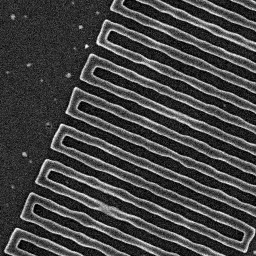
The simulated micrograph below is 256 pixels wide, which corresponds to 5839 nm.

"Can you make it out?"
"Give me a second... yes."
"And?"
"groups of lines, slits or small figures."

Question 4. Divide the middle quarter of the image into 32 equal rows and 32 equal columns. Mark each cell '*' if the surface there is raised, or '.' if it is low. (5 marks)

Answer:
.....********........*****......
.....**....*****.......*****....
....***......*****.......*****..
....*****.......****.......*****
......*****.......*****.......**
.........****.......*****.......
...*.......*****.......****.....
..****.......*****......******..
..*******......*****.......*****
..**.******.......****.......***
.**.....******......*****.......
.***......******......*****.....
.*****.......*****.......****...
...******.....******.......****.
......*****.......****........**
*......******.......*****......*
***.......*****.......*****.....
******......******......*****...
..******......******......******
.....*****.......*****.......***
........****.......*****.......*
***.......*****......******.....
*****.......*****......*****....
...*****......******.......****.
.....*****......******.......***
.......*****.......*****......**
***......*****........****......
****........*****.......****....
..******......*****.......*****.
.....****.......*****.......****
.......*****......******.......*
**........*****......*****......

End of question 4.